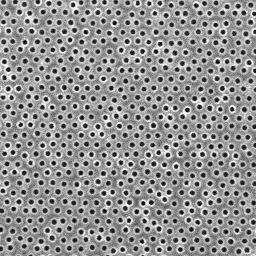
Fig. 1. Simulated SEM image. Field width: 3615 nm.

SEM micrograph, a regular array of holes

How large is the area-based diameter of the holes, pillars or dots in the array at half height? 74.7 nanometres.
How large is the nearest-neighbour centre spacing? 132 nm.